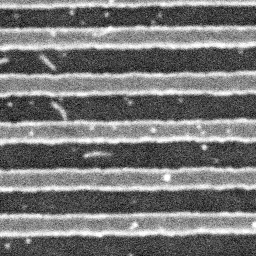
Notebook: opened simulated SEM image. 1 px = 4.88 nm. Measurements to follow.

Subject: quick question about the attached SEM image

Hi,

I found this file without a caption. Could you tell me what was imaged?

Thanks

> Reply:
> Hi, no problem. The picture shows lines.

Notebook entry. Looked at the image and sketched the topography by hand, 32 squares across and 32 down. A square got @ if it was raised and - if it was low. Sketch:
@@@@@@@@@@@@@@@@@@@@@@@-@@@@@@@@
--------------------------------
--------------------------------
-----------------@-@@--@@@@@@@@@
@@@@@@@@@@@@@@@@@@@@@@@@@@@@@@@@
@@@@@@@@@@@@@@@@@@@@@@@@@@@@@@@@
--------------------------------
--------------------------------
--------------------------------
@@@@@@-@@@@@@@@@@@@@@@@@@@@@@@@@
@@@@@@@@@@@@@@@@@@@@@@@@@@@@@@@@
@@@@@@@@@@@@@@@@@@@@@@@@@@@@@@@@
--------------------------------
--------------------------------
--------------------------------
@@@@@@@@@@@@@@@@@@@@@@@@@@@@@@@@
@@@@@@@@@@@@@@@@@@@@@@@@@@@@@@@@
@@@@@@@@@@@@@@@@@@-@@----@-@--@@
--------------------------------
--------------------------------
--------------------------------
@@@@@@@@@@@@@@@@@@@@@@@@@@@@@@@@
@@@@@@@@@@@@@@@@@@@@@@@@@@@@@@@@
@@@@@@@@@@@@@@@@@@@@@@@----@----
--------------------------------
--------------------------------
--------------------------------
@@@@@@@@@@@@@@@@@@@@@@@@@@@@@@@@
@@@@@@@@@@@@@@@@@@@@@@@@@@@@@@@@
--------------------------------
--------------------------------
--------------------------------